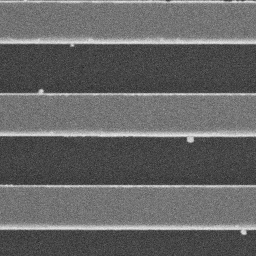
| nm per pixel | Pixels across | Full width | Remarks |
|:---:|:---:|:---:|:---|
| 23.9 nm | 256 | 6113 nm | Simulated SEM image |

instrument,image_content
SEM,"lines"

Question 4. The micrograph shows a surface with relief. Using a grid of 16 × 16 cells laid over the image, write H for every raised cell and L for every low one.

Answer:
HHHHHHHHHHHHHHHH
HHHHHHHHHHHHHHHH
HHHHHHHHHHHHHHHH
LLLLLLLLLLLLLLLL
LLLLLLLLLLLLLLLL
LLLLLLLLLLLLLLLL
HHHHHHHHHHHHHHHH
HHHHHHHHHHHHHHHH
LLLLLLLLLLLLLLLL
LLLLLLLLLLLLLLLL
LLLLLLLLLLLLLLLL
LLLLLLLLLLLLLLLL
HHHHHHHHHHHHHHHH
HHHHHHHHHHHHHHHH
LLLLLLLLLLLLLLLL
LLLLLLLLLLLLLLLL